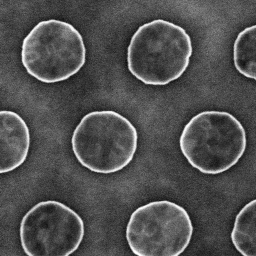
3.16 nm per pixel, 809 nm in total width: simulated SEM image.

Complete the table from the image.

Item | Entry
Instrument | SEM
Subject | raised bodies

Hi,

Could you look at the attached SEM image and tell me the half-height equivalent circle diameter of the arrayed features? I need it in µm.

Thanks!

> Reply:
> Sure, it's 0.197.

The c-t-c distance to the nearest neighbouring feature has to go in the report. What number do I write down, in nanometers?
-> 329